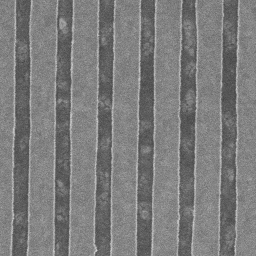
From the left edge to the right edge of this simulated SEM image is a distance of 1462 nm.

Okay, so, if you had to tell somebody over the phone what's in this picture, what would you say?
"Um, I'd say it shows parallel lines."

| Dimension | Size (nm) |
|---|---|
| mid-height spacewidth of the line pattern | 89.2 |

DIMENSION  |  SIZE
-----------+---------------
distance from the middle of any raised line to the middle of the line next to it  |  236 nanometres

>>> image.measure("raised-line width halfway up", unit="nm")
146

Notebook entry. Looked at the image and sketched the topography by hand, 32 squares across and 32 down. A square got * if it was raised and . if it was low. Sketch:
**..***..***..****.****..***..**
**..***..***..****.****..***..**
**..***..***..***..****..***..**
**..***..***..***..****..***..**
**..***..***..***..****..***..**
**..***..***..***..****..***..**
**..***..***..***..****..***..**
**..***..***..***..***...***..**
**..***..***..****.***...***..**
**..***..***..***..***...***..**
**..***..***..***..****..***..**
**..***..***..***..***...***..**
**..***..***..***..***...***..**
**..***..***..***..***...***..**
**..***..***..***..***...***..**
**..***..***..***..***...***..**
**..***..***..***..***..****..**
**..***..***..***..***..****..**
**..***..***..***..***..****..**
**..***..***..***..***..****.***
**..***..***..***..***..****..**
**..***..***..***..***..****..**
**..***..***..***..***..***..***
**..***..***..***..***..***...**
**..***..***..***..***..***...**
**..***..***..***..***..***...**
**..***..***..***..***..***...**
**..***..***..***..***..***...**
*...***..***..***..***..***..***
*...***..***..***..***..***...**
*...***..***..***..***..***..***
*..****..***..***..***..***..***